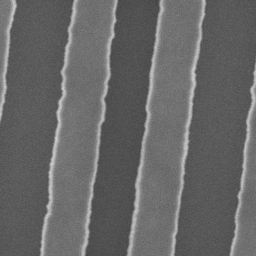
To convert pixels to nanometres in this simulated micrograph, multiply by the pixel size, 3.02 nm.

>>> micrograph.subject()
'lines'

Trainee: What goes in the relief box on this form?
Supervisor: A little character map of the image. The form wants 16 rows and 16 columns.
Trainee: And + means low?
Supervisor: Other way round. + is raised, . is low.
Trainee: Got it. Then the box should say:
+....++...+++...
+...+++...+++...
+...+++...+++...
+...+++...++....
....+++..+++....
....+++..+++....
....+++..+++....
....++...+++...+
...+++...+++...+
...+++...+++...+
...+++...++....+
...+++...++....+
...+++..+++....+
...+++..+++....+
...++...+++....+
...++...+++...++